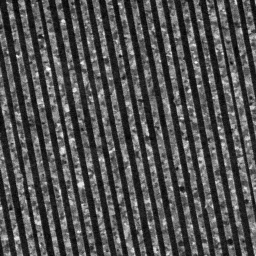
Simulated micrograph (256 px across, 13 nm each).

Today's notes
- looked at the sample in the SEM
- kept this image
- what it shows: parallel lines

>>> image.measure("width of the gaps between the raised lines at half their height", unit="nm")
83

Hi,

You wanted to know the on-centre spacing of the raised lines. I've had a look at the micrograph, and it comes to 159 nm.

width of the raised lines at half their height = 0.0766 µm